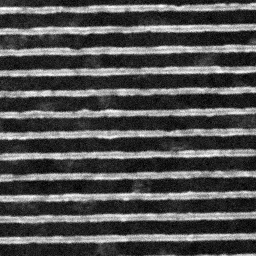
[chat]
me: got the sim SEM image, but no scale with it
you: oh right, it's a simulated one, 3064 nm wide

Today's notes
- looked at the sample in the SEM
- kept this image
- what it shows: parallel lines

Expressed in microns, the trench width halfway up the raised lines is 0.19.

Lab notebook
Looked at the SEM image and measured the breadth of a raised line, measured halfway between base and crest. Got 53.9 nm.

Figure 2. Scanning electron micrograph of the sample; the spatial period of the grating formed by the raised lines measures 20.9 px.